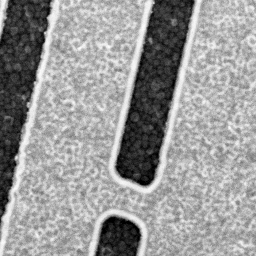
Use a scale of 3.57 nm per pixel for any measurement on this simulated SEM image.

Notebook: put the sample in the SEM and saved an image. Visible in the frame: one or a few lines or trenches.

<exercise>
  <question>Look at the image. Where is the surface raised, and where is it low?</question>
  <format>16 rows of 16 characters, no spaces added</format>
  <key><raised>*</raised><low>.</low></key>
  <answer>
...******...****
...******...****
...******...****
...******...****
...*****...*****
..******...*****
..******...*****
..******...*****
..*****....*****
.******...******
.******...******
.*******..******
.***************
*******.********
******...*******
******...*******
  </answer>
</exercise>